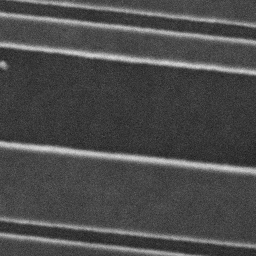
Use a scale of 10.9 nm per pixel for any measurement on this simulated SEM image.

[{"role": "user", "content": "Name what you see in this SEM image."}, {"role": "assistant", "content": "lines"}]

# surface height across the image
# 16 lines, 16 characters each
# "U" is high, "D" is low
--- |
UUUUUUUUUUUUUUUU
UUUUUUUUUUUUUUUU
UUUUUUUUUUUUUUUU
DDDDDDUUUUUUUUUU
DDDDDDDDDDDDDDDU
DDDDDDDDDDDDDDDD
DDDDDDDDDDDDDDDD
DDDDDDDDDDDDDDDD
DDDDDDDDDDDDDDDD
UUUUDDDDDDDDDDDD
UUUUUUUUUUUUUUDD
UUUUUUUUUUUUUUUU
UUUUUUUUUUUUUUUU
UUUUUUUUUUUUUUUU
UUUUUUUUUUUUUUUU
UUUUUUUUUUUUUUUU